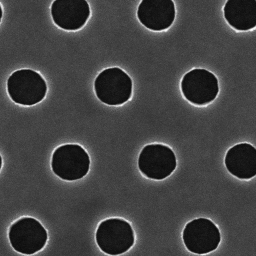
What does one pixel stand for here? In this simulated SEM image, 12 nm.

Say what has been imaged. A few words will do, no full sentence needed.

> holes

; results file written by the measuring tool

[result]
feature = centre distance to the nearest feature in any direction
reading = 1040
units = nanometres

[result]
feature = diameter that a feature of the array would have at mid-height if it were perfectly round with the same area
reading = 449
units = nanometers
